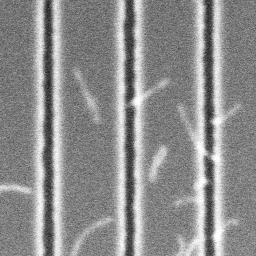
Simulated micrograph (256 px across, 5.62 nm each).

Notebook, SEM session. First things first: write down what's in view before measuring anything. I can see lines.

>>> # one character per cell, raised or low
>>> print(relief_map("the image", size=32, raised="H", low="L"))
HHHHHLLHHHHHHHHLLHHHHHHHHLLHHHHH
HHHHHLLHHHHHHHHLLHHHHHHHHLLHHHHH
HHHHHLLHHHHHHHHLLHHHHHHHHLLHHHHH
HHHHHLLHHHHHHHHLLHHHHHHHHLLHHHHH
HHHHHLLHHHHHHHHLLHHHHHHHHLLHHHHH
HHHHHLLHHHHHHHHLLHHHHHHHHLLHHHHH
HHHHHLLHHHHHHHHLLHHHHHHHHLLHHHHH
HHHHHLLHHHHHHHHLLHHHHHHHHLLHHHHH
HHHHHLLHHHHHHHHLLHHHHHHHHLLHHHHH
HHHHHLLHHHHHHHHLLHHHHHHHHLLHHHHH
HHHHHLLHHHHHHHHLLHHHHHHHHLLHHHHH
HHHHHLLHHHHHHHHLLHHHHHHHHLLHHHHH
HHHHHLLHHHHHHHHLLHHHHHHHHLLHHHHH
HHHHHLLHHHHHHHHLLHHHHHHHHLLHHHHH
HHHHHLLHHHHHHHHLLHHHHHHHHLLHHHHH
HHHHHLLHHHHHHHHLLHHHHHHHHLLHHHHH
HHHHHLLHHHHHHHHLLHHHHHHHHLLHHHHH
HHHHHLLHHHHHHHHLLHHHHHHHHLLHHHHH
HHHHHLLHHHHHHHHLLHHHHHHHHLLHHHHH
HHHHHLLHHHHHHHHLLHHHHHHHHLLHHHHH
HHHHHLLHHHHHHHHLLHHHHHHHHLLHHHHH
HHHHHLLHHHHHHHHLLHHHHHHHHLLHHHHH
HHHHHLLHHHHHHHHLLHHHHHHHHLLHHHHH
HHHHHLLHHHHHHHHLLHHHHHHHHLLHHHHH
HHHHHLLHHHHHHHHLLHHHHHHHHLLHHHHH
HHHHHLLHHHHHHHHLLHHHHHHHHLLHHHHH
HHHHHLLHHHHHHHHLLHHHHHHHHLLHHHHH
HHHHHLLHHHHHHHHLLHHHHHHHHLLHHHHH
HHHHHLLHHHHHHHHLLHHHHHHHHLLHHHHH
HHHHHLLHHHHHHHHHLHHHHHHHHLLHHHHH
HHHHHLLHHHHHHHHLLHHHHHHHHLLHHHHH
HHHHHLLHHHHHHHHLLHHHHHHHHLLHHHHH